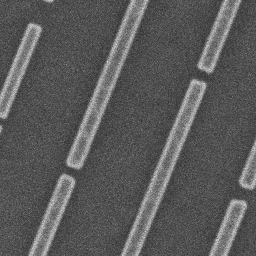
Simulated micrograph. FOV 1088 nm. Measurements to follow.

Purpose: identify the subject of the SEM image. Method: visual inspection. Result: one or a few lines or trenches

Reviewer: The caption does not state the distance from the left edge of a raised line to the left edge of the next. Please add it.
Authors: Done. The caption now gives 364 nanometers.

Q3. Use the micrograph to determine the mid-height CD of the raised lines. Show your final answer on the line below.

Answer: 0.0546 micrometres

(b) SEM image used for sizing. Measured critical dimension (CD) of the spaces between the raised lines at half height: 309 nanometers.